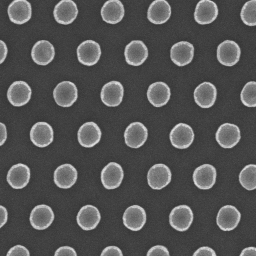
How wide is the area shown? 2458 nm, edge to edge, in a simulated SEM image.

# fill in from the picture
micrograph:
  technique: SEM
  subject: a regular array of raised bodies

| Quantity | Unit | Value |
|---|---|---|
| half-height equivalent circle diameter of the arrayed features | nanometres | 231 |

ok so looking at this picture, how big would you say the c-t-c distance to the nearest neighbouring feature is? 444 nm